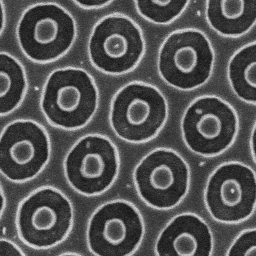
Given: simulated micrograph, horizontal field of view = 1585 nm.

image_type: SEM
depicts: a regular array of ring-shaped grooves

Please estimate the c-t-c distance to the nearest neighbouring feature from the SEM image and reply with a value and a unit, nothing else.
434 nanometres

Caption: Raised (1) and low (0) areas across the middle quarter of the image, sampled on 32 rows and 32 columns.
11111111000000000011111100001111
00001111110000001111111100000111
00000011111111111111111100000000
00000001111111111111111110000000
00000001111111111111111111000000
00000001111111110000011111110000
11100000111111000000000111111111
11110000111110000000000011111111
11110000111110000000000001111111
11100000111100000111000001111111
11100000111100001111100001111111
00000000111100001111100000111110
00000001111100001111100001111100
00000001111100001111000001111100
00000011111100000110000001111100
00001111111100000000000011111100
11111111111110000000000111111100
11111111111110000000000111111100
11111000001111100000011111111100
11110000000111111111111111111110
11100000000011111111111111111110
11000000000001111111111000111111
10000000000001111111100000001111
10000111100001111111000000000111
00000111100001111110000000000011
00000111110001111110000000000001
00000111100001111100000111000001
10000111100001111100001111100001
10000000000011111100001111100001
11000000000011111100001111100001
11000000000111111100000111000001
11100000001111111110000000000011